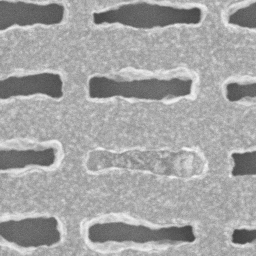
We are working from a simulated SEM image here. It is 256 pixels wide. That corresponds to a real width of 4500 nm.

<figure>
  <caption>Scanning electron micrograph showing holes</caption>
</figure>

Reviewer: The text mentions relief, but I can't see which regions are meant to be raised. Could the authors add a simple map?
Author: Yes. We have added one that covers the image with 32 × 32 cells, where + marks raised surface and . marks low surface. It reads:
.....+..++++++++....++++++++++..
........+++++............+++....
........++++.............+++....
.++++++++++++++++...+++++++++++.
++++++++++++++++++++++++++++++++
++++++++++++++++++++++++++++++++
++++++++++++++++++++++++++++++++
++++++++++++++++++++++++++++++++
++++++++++++++++++++++++++++++++
+.......++++........++.+++++++++
........+++.............+++++...
........+++.............++++....
++++++++++++++++++...+++++++....
++++++++++++++++++++++++++++++++
++++++++++++++++++++++++++++++++
++++++++++++++++++++++++++++++++
++++++++++++++++++++++++++++++++
++++++++++++++++++++++++++++++++
.......+++++++++++++++++++++++++
.......++++++++.......+++++++...
.......++++++++......++++++++...
+++++++++++++++++++..++++++++...
++++++++++++++++++++++++++++++++
++++++++++++++++++++++++++++++++
++++++++++++++++++++++++++++++++
++++++++++++++++++++++++++++++++
++++++++++++++++++++++++++++++++
+......++++++..+++++++++++++++++
........+++.............++++++++
........+++.............+++++...
+......++++...+........+++++++.+
++++++++++++++++++++++++++++++++